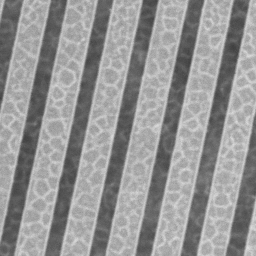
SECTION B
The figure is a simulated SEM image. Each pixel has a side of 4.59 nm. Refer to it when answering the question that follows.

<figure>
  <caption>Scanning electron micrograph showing parallel lines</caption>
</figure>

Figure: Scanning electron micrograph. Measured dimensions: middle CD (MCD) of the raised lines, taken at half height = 25.8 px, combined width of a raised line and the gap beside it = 204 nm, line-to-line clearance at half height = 83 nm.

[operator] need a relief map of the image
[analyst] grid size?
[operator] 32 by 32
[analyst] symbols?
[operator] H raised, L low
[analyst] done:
LLLHHHLLHHHHLLHHHHLLHHHLLLHHHLLH
LLLHHHLLHHHHLLHHHLLLHHHLLHHHHLLH
LLLHHHLLHHHHLLHHHLLHHHHLLHHHHLLH
LLHHHLLLHHHLLLHHHLLHHHHLLHHHLLLH
LLHHHLLLHHHLLHHHHLLHHHHLLHHHLLLH
LLHHHLLHHHHLLHHHLLLHHHLLLHHHLLHH
LLHHHLLHHHHLLHHHLLLHHHLLHHHHLLHH
LHHHHLLHHHLLLHHHLLHHHHLLHHHLLLHH
LHHHLLLHHHLLLHHHLLHHHHLLHHHLLLHH
LHHHLLLHHHLLHHHHLLHHHLLLHHHLLHHH
LHHHLLHHHHLLHHHLLLHHHLLHHHHLLHHH
LHHHLLHHHHLLHHHLLLHHHLLHHHHLLHHH
HHHHLLHHHLLLHHHLLHHHHLLHHHLLLHHH
HHHLLLHHHLLLHHHLLHHHHLLHHHLLLHHH
HHHLLLHHHLLHHHHLLHHHLLLHHHLLHHHH
HHHLLHHHHLLHHHLLLHHHLLLHHHLLHHHL
HHHLLHHHHLLHHHLLLHHHLLHHHHLLHHHL
HHHLLHHHLLLHHHLLHHHHLLHHHLLLHHHL
HHLLLHHHLLHHHHLLHHHLLLHHHLLLHHHL
HHLLLHHHLLHHHHLLHHHLLLHHHLLHHHHL
HHLLHHHHLLHHHLLLHHHLLHHHHLLHHHLL
HHLLHHHHLLHHHLLLHHHLLHHHHLLHHHLL
HHLLHHHLLLHHHLLHHHHLLHHHLLLHHHLL
HLLLHHHLLHHHHLLHHHHLLHHHLLLHHHLL
HLLHHHHLLHHHHLLHHHLLLHHHLLHHHHLL
HLLHHHHLLHHHLLLHHHLLHHHHLLHHHLLL
HLLHHHHLLHHHLLHHHHLLHHHHLLHHHLLL
LLLHHHLLLHHHLLHHHHLLHHHLLLHHHLLL
LLLHHHLLHHHHLLHHHLLLHHHLLLHHHLLH
LLHHHHLLHHHLLLHHHLLLHHHLLHHHHLLH
LLHHHHLLHHHLLLHHHLLHHHHLLHHHLLLH
LLHHHLLLHHHLLHHHHLLHHHLLLHHHLLLH